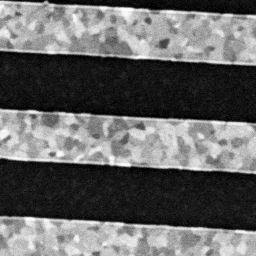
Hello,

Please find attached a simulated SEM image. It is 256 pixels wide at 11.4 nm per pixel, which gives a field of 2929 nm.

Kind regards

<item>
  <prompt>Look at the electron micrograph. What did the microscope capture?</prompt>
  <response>one or a few lines or trenches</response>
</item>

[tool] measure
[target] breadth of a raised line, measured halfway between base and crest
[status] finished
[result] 0.544 µm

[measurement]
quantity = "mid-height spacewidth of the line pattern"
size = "688 nm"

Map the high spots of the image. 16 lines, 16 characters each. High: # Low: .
#######.........
################
################
.......#########
................
................
................
##########......
################
################
...........#####
................
................
................
###############.
################